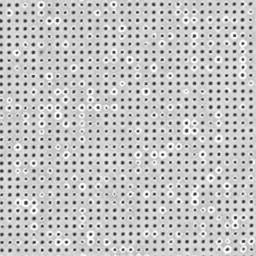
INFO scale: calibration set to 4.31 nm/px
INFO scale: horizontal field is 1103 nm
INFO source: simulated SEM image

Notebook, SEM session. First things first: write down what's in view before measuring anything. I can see a regular array of holes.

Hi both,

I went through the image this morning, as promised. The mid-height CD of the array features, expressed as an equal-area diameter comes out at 15.4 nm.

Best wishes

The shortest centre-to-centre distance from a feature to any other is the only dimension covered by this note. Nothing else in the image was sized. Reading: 33.1 nm